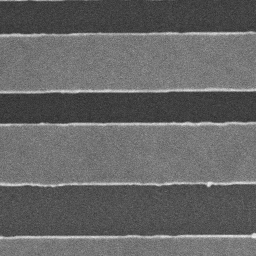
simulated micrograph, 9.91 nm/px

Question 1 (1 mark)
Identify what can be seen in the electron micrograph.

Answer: lines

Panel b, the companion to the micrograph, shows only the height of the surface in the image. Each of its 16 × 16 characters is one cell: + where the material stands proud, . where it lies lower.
................
................
++++++++++++++++
++++++++++++++++
++++++++++++++++
++++++++++++++++
................
................
++++++++++++++++
++++++++++++++++
++++++++++++++++
+++++++++++.+++.
................
................
................
++++++++++++++++